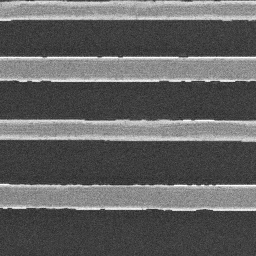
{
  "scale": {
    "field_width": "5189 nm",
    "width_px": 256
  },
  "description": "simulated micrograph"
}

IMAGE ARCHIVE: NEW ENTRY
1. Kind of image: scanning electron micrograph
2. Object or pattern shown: lines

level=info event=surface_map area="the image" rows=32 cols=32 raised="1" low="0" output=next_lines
01111111111111111111111111111111
11111111111111111111111111111111
00000000000000000000000000000000
00000000000000000000000000000000
00000000000000000000000000000000
00000000000000000000000000000000
00000000000000000000000000000000
11111111111111111111111111111111
11111111111111111111111111111111
11111111111111111111111111111111
00000000000000000000000000000000
00000000000000000000000000000000
00000000000000000000000000000000
00000000000000000000000000000000
00000000000000000000000000000000
11111111111111111111111111111111
11111111111111111111111111111111
00000000000000000000000000000000
00000000000000000000000000000000
00000000000000000000000000000000
00000000000000000000000000000000
00000000000000000000000000000000
00000000000000000000000000000000
11111111111111111111111111111111
11111111111111111111111111111111
11111111111111111111111111111111
00000000000000000000000000000000
00000000000000000000000000000000
00000000000000000000000000000000
00000000000000000000000000000000
00000000000000000000000000000000
00000000000000000000000000000000